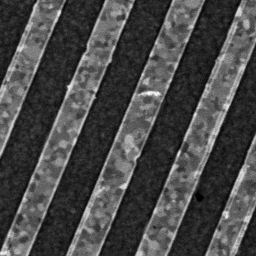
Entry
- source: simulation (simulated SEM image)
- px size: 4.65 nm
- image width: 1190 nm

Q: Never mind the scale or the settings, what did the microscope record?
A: one or a few lines or trenches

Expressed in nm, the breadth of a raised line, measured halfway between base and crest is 129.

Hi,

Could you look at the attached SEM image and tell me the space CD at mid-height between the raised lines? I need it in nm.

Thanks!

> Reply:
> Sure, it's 171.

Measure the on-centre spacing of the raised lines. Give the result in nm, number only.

296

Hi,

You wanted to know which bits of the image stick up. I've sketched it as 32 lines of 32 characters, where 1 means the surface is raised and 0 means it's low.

00000111000001111000001110000011
00001111000001110000011110000011
00001110000011110000011100000111
00011110000011100000111100000111
00011100000111100000111100001111
00011100000111000001111000001111
00111000000111000001111000001110
00111000001111000001110000011110
01111000001110000011110000011110
01110000011110000011110000111100
11110000011100000111100000111100
11100000111100000111100000111000
11100000111100000111000001111000
11100000111000001111000001110000
11000001111000001110000011110000
11000001110000011110000011110000
10000011110000011110000111100000
10000011100000111100000111100000
00000011100000111100000111000001
00000111100000111000001111000001
00000111000001111000001111000001
00001111000001111000011110000011
00001110000011110000011110000011
00011110000011110000011100000111
00011110000011100000111100000111
00011100000111100000111000001111
00111100000111000001111000001110
00111000001111000001111000001110
01111000001111000011110000011110
01110000011110000011110000011100
01110000011110000011100000111100
11110000111100000111100000111100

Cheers